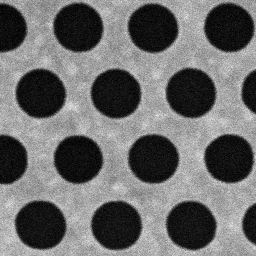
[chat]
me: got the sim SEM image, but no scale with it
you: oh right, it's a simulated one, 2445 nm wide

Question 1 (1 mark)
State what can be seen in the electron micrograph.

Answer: a regular array of holes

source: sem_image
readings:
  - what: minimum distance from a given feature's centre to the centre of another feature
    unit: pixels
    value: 75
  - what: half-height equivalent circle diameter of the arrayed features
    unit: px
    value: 50.6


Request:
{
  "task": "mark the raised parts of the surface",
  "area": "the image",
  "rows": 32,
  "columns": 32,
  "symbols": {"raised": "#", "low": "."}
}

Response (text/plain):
.########..#######..#######..###
...####.....#####.....####.....#
...####......###......####......
...####......###......###.......
...####......###......####......
...#####....#####.....####.....#
.########..#######..########.###
################################
#######################.########
###....#####.....####.....#####.
##......####.....####......###..
##......###.......###......###..
##......###.......###......###..
##......####.....####......####.
####..#######...#######..#######
################################
################################
..######....#####....######....#
...####......###......####.....#
...####......###......####......
...####......###......####......
...####.....####......####.....#
..######...#######...######...##
################################
################################
###....######...######...#######
##......####.....####.....#####.
##......###.......###......###..
##......###.......###......###..
##......####......###......####.
###....#####.....#####....######
################################